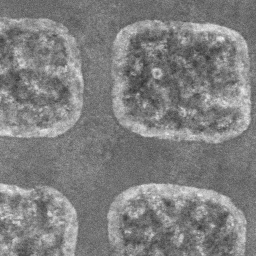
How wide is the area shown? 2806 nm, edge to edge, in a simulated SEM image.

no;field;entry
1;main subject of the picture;raised bodies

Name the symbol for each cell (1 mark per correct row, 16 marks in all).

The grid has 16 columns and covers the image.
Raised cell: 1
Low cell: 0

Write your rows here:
0000000000000000
1000000000000000
1111000011111110
1111100111111110
1111100111111110
1111100111111110
1111100111111110
1111000011111110
0000000000001100
0000000000000000
0000000000000000
0000000000000000
1111000011111100
1111000111111110
1111000111111110
1111000111111110